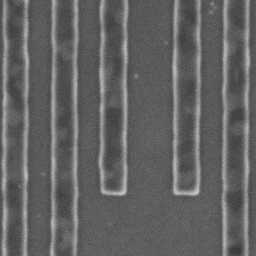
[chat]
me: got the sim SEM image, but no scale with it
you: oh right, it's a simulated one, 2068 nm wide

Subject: wiring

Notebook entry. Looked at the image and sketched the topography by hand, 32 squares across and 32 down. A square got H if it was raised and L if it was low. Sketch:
HHHLLLLHHHLLLHHHLLLLLLHHHLLLHHHL
HHHLLLLHHHLLLHHHLLLLLLHHHLLLHHHL
HHHLLLLHHHLLLHHHLLLLLLHHHLLLHHHL
HHHLLLLHHHLLLHHHLLLLLLHHHLLLHHHL
HHHLLLLHHHLLLHHHLLLLLLHHHLLLHHHL
LHHLLLLHHHLLLHHHLLLLLLHHHLLLHHHL
LHHLLLLHHHLLLHHHLLLLLLHHHLLLHHHL
HHHLLLLHHHLLLHHHLLLLLLHHHLLLHHHL
HHHLLLLHHHLLLHHHLLLLLLHHHLLLHHHL
HHHLLLLHHHLLLHHHLLLLLLHHHLLLHHHL
HHHLLLLHHHLLLHHHLLLLLLHHHLLLHHHL
HHHLLLLHHHLLLHHHLLLLLLHHHLLLHHHL
HHHLLLLHHHLLLHHHLLLLLLHHHLLLHHHL
HHHLLLLHHHLLLHHHLLLLLLHHHLLLHHHL
HHHLLLLHHHLLLHHHLLLLLLHHHLLLHHHL
HHHLLLLHHHLLLHHHLLLLLLHHHLLLHHHL
HHHLLLLHHHLLLHHHLLLLLLHHHLLLHHHL
HHHLLLLHHHLLLHHHLLLLLLHHHLLLHHHL
HHHLLLLHHHLLLHHHLLLLLLHHHLLLHHHL
HHHLLLLHHHLLHHHHLLLLLLHHHLLLHHHL
HHHLLLLHHHLLHHHHLLLLLLHHHLLLHHHL
HHHLLLLHHLLLLHHHLLLLLLHHHLLLHHHL
HHHLLLLHHHLLLHHHLLLLLLHHHLLLHHHL
HHHLLLLHHHLLLHHHLLLLLLHHHLLLHHHL
HHHLLLLHHHLLLLLLLLLLLLLLLLLLHHHL
HHHLLLLHHHLLLLLLLLLLLLLLLLLLHHHL
HHHLLLLHHHLLLLLLLLLLLLLLLLLLHHHL
HHHLLLLHHHLLLLLLLLLLLLLLLLLLHHHL
HHHLLLLHHHLLLLLLLLLLLLLLLLLLHHHL
HHHLLLLHHHLLLLLLLLLLLLLLLLLLHHHL
HHHLLLHHHHLLLLLLLLLLLLLLLLLLHHHL
HHHLLLHHHLLLLLLLLLLLLLLLLLLLHHHL